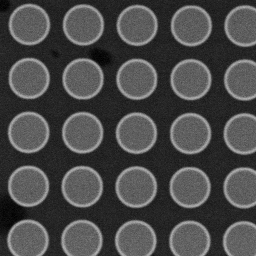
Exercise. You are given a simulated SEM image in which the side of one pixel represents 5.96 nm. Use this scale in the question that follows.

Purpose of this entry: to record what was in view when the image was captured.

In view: an array of small figures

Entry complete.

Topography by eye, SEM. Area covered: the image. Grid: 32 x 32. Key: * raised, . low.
................................
..****...***...****...****...***
.*****..*****..*****.*****..****
.*****..*****..*****.*****..****
..****..*****..****...****..****
...*.....**.....**.....**....***
................................
...**....**.....**.....**.......
.*****..*****..****...****...***
.*****..*****..*****.*****..****
.*****..*****..*****.*****..****
..****..****...****...****...***
................................
................................
..***....***....**.....**....***
.*****..*****..****...****..****
.*****..*****..*****.*****..****
.*****..*****..*****.*****..****
..***....***...****...****...***
................................
................................
..***...****...****...***....***
.*****..*****..****..*****..****
.*****..*****.******.*****..****
.*****..*****..****..*****..****
..***....***....**....***....***
................................
................................
.*****..****...****...****...***
.*****..*****.*****..*****..****
.*****..*****.******.*****..****
.*****..****...****..*****..****